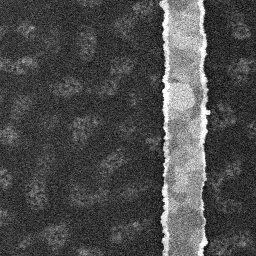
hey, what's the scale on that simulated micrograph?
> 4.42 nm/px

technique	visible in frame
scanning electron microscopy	one or a few lines or trenches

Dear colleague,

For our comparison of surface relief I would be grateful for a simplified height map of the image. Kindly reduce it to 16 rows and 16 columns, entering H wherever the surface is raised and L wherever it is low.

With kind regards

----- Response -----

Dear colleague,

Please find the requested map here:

LLLLLLLLLLHHHLLL
LLLLLLLLLLHHHLLL
LLLLLLLLLLHHHLLL
LLLLLLLLLLHHHLLL
LLLLLLLLLLHHHLLL
LLLLLLLLLLHHHLLL
LLLLLLLLLLHHHLLL
LLLLLLLLLLHHHLLL
LLLLLLLLLLHHHLLL
LLLLLLLLLLHHHLLL
LLLLLLLLLLHHHLLL
LLLLLLLLLLHHHLLL
LLLLLLLLLLHHHLLL
LLLLLLLLLLHHHLLL
LLLLLLLLLLHHHLLL
LLLLLLLLLLHHHLLL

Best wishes